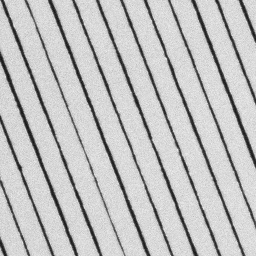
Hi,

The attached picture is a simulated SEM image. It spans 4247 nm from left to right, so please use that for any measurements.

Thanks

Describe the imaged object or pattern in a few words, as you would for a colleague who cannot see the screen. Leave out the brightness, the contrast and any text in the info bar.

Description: parallel lines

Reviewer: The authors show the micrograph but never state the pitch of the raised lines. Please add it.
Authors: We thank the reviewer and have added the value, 369 nanometers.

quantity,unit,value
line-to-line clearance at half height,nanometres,296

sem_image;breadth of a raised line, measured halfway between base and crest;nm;69.7